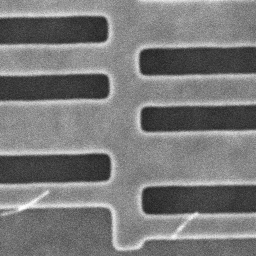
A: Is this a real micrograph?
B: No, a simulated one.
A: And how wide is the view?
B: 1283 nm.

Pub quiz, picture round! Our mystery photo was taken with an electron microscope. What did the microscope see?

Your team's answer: groups of lines, slits or small figures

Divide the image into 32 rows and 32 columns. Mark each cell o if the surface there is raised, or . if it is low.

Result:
oooooooooooooooooooooooooooooooo
oooooooooooooooooooooooooooooooo
.............ooooooooooooooooooo
..............oooooooooooooooooo
..............oooooooooooooooooo
............oooooooooooooooooooo
oooooooooooooooooo..............
ooooooooooooooooo...............
ooooooooooooooooo...............
.............ooooo.....ooooooooo
..............oooooooooooooooooo
..............oooooooooooooooooo
.........oo.oooooooooooooooooooo
oooooooooooooooooo..............
oooooooooooooooooo..............
oooooooooooooooooo..............
oooooooooooooooooo.....ooooooooo
oooooooooooooooooooooooooooooooo
oooooooooooooooooooooooooooooooo
..............oooooooooooooooooo
..............oooooooooooooooooo
..............oooooooooooooooooo
.............ooooooooooooooooooo
oooooooooooooooooo..............
oooooooooooooooooo..............
oooooooooooooooooo..............
..............oooo..............
..............oooooooooooooooooo
..............oooooooooooooooooo
..............oooooooooooooooooo
..............oooo..............
................................